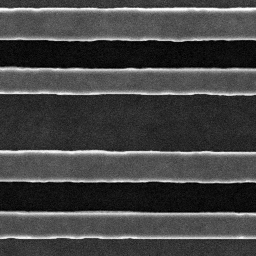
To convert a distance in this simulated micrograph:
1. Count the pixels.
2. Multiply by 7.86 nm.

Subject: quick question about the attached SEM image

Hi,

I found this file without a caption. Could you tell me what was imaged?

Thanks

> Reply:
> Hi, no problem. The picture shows lines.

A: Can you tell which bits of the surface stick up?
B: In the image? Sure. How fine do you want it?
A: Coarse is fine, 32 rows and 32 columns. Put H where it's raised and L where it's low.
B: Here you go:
LLLLLLLLLLLLLLLLLLLLLLLLLLLLLLLL
HHHHHHHHHHHHHHHHHHHHHHHHHHHHHHHH
HHHHHHHHHHHHHHHHHHHHHHHHHHHHHHHH
HHHHHHHHHHHHHHHHHHHHHHHHHHHHHHHH
HHHHHHHHHHHHHHHHHHHHHHHHHHHHHHHH
LLLLLLLLLLLLLLLLLLLLLLLLLLLLLLLL
LLLLLLLLLLLLLLLLLLLLLLLLLLLLLLLL
LLLLLLLLLLLLLLLLLLLLLLLLLLLLLLLL
LLLLLLLLLLLLLLLLLLLLLLLLLLLLLLLL
HHHHHHHHHHHHHHHHHHHHHHHHHHHHHHHH
HHHHHHHHHHHHHHHHHHHHHHHHHHHHHHHH
HHHHHHHHHHHHHHHHHHHHHHHHHHHHHHHH
LLLLLLLLLLLLLLLLLLLLLLLLLLLLLLLL
LLLLLLLLLLLLLLLLLLLLLLLLLLLLLLLL
LLLLLLLLLLLLLLLLLLLLLLLLLLLLLLLL
LLLLLLLLLLLLLLLLLLLLLLLLLLLLLLLL
LLLLLLLLLLLLLLLLLLLLLLLLLLLLLLLL
LLLLLLLLLLLLLLLLLLLLLLLLLLLLLLLL
LLLLLLLLLLLLLLLLLLLLLLLLLLLLLLLL
HHHHHHHHHHHHHHHHHHHHHHHHHHHHHHHH
HHHHHHHHHHHHHHHHHHHHHHHHHHHHHHHH
HHHHHHHHHHHHHHHHHHHHHHHHHHHHHHHH
HHHHHHHHHHHHHHHHHHHHHHHHHHHHHHHH
LLLLLLLLLLLLLLLLLLLLLLLLLLLLLLLL
LLLLLLLLLLLLLLLLLLLLLLLLLLLLLLLL
LLLLLLLLLLLLLLLLLLLLLLLLLLLLLLLL
LLLLLLLLLLLLLLLLLLLLLLLLLLLLLLLL
HHHHHHHHHHHHHHHHHHHHHHHHHHHHHHHH
HHHHHHHHHHHHHHHHHHHHHHHHHHHHHHHH
HHHHHHHHHHHHHHHHHHHHHHHHHHHHHHHH
LLLLLLLLLLLLLLLLLLLLLLLLLLLLLLLL
LLLLLLLLLLLLLLLLLLLLLLLLLLLLLLLL